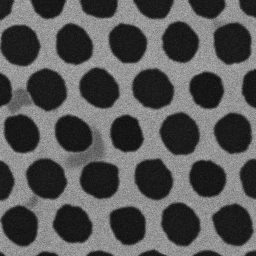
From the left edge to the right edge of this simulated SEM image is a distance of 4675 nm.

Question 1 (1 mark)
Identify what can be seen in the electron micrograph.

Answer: a regular array of holes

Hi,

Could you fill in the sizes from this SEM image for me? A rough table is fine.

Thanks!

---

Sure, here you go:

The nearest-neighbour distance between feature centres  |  953 nm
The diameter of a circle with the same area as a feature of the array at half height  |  0.715 µm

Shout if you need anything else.